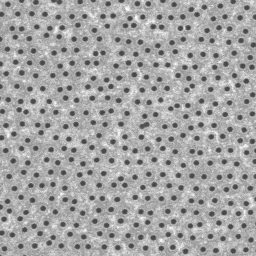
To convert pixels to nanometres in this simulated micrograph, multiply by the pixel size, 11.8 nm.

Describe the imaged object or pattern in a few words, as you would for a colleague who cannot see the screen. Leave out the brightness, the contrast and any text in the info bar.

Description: a regular array of holes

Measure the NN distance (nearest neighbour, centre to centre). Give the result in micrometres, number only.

0.133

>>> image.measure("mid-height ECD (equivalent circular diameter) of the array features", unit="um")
0.0681